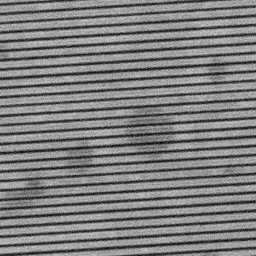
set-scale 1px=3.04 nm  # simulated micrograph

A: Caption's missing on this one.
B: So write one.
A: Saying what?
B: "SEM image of parallel lines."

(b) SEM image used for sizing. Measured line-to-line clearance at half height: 11 nm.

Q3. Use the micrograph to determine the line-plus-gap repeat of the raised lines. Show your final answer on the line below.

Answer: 0.0281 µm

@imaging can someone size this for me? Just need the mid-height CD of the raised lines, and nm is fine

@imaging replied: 16.7